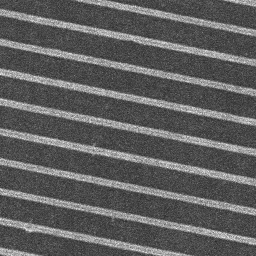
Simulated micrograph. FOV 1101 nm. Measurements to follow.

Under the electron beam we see parallel lines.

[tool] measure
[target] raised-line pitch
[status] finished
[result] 0.126 µm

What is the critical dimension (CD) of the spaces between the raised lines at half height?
103 nm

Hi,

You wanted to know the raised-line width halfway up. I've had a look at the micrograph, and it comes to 0.0232 um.